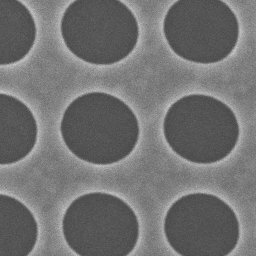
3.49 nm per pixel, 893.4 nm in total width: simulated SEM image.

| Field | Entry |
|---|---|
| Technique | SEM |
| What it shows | holes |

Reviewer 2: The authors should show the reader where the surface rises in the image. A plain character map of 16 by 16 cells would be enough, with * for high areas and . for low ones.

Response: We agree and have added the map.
..**....***...**
..**.....*.....*
..**.....*.....*
..***...***...**
****************
****************
.***....***...**
..**.....*.....*
..**.....*.....*
..***...***...**
****************
****************
.****...***...**
..**....**.....*
..**.....*.....*
..**....***....*